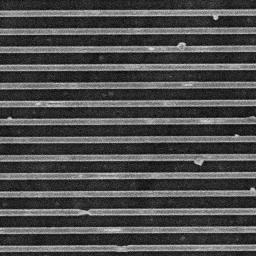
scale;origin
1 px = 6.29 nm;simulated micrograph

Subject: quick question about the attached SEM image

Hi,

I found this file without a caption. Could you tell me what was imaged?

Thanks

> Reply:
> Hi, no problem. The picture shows parallel lines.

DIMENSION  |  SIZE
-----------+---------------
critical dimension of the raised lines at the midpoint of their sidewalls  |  0.0342 µm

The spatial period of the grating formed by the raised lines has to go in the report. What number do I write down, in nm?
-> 114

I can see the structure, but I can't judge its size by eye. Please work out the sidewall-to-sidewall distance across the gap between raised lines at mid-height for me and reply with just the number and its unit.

79.4 nm